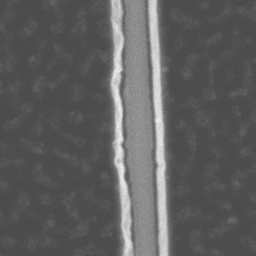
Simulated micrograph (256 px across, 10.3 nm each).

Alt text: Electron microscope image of one or a few lines or trenches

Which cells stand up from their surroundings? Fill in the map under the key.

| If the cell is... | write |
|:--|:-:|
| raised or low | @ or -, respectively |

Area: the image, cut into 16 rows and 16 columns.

@@@@@@@---@@@@@@
@@@@@@@---@@@@@@
@@@@@@@---@@@@@@
@@@@@@@---@@@@@@
@@@@@@@---@@@@@@
@@@@@@@---@@@@@@
@@@@@@@---@@@@@@
@@@@@@@---@@@@@@
@@@@@@@---@@@@@@
@@@@@@@---@@@@@@
@@@@@@@@--@@@@@@
@@@@@@@@--@@@@@@
@@@@@@@@--@@@@@@
@@@@@@@@--@@@@@@
@@@@@@@@--@@@@@@
@@@@@@@@--@@@@@@